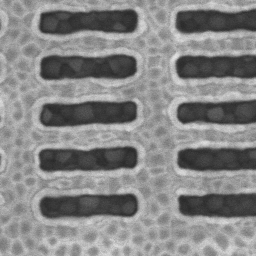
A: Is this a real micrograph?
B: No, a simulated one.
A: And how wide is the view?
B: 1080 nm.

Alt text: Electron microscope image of holes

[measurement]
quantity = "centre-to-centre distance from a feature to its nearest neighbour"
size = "193 nm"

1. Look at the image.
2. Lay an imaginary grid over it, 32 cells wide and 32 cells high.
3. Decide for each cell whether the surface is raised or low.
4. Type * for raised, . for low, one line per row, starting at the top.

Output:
********************************
******...**......*****......*...
*****............*****..........
*****............*****..........
*******.************************
********************************
********************************
*****............*****..........
*****............*****..........
*****...........******..........
********************************
********************************
*****************************.*.
*****............*****..........
*****............*****..........
*****..........********.*......*
********************************
********************************
******...***.....*******.......*
*****............*****..........
*****............*****..........
******.*******************.*****
********************************
********************************
******...........******.........
*****............*****..........
*****............*****..........
********************************
********************************
********************************
********************************
********************************